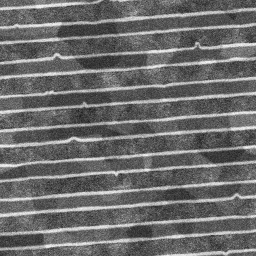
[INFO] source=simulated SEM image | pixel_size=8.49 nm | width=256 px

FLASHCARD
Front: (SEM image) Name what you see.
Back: parallel lines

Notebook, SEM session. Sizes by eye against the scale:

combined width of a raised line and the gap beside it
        291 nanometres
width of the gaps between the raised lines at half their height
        162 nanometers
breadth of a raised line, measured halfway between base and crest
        0.131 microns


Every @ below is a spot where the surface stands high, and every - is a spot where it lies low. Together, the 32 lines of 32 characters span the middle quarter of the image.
@@@@@@@@@@@@@@@@@@@@@@@@--------
@@@@@@@@@@@@@@------------------
--------------------------------
--------------------------------
--------------------------------
---------------------@@@-@@@@@@@
----------@@@@@@@@@@@@@@@@@@@@@@
@@@@@@@@@@@@@@@@@@@@@@@@@@@@@@@@
@@@@@@@@@@@@@@@@@@@@@@@@@@@@@@@@
@@@@@@@@@@@@@@@@@@@@-@----------
@@@@@---------------------------
--------------------------------
--------------------------------
------------------------------@@
----------------@@@@@@@@@@@@@@@@
---@@@@@@@@@@@@@@@@@@@@@@@@@@@@@
@@@@@@@@@@@@@@@@@@@@@@@@@@@@@@@@
@@@@@@@@@@@@@@@@@@@@@@@@--------
@@@@@@@@@@@@--------------------
--------------------------------
--------------------------------
--------------------------------
----------------------@@-@@@@@@@
------------@@@@@@@@@@@@@@@@@@@@
@@@@@@@@@@@@@@@@@@@@@@@@@@@@@@@@
@@@@@@@@@@@@@@@@@@@@@@@@@@@@@@@@
@@@@@@@@@@@@@@@@@@-@@-----------
@@@@@---------------------------
--------------------------------
--------------------------------
-------------------------------@
------------------@@@@@@@@@@@@@@